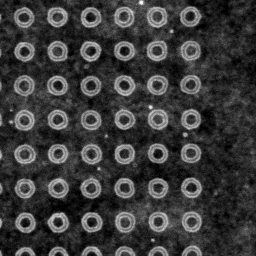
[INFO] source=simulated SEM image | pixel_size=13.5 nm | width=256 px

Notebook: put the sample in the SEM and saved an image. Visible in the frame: a regular array of ring-shaped raised bodies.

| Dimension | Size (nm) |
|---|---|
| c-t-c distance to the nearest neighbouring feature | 442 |